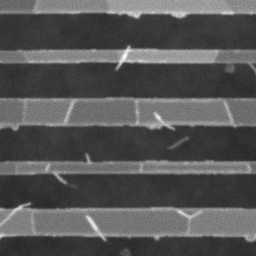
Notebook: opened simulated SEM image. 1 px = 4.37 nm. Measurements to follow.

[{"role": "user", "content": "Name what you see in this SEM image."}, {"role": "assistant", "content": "lines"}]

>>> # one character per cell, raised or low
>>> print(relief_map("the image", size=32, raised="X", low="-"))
XXXXXXXXXXXXXXXXXXXXXXXXXXXXXXXX
XXXXX--XXX---XXXXXXXXXXXXXXXXXXX
--------------------------------
--------------------------------
--------------------------------
--------------------------------
XXXXXXXXXXXXXXXXXXXXXXXXXXX-XXXX
XXXXXXXXXXXXXXXXXXXXXXXXXXX-XXXX
--------------------------------
--------------------------------
--------------------------------
--------------------------------
XX---XXXX---------XX--XXX-XX-XXX
XXXXXXXXX--------XXXXXXXXXXX-XXX
XXXXXXXX---------XXXXXXXXXXXXXXX
----XXXX----------XXXX--------XX
--------------------------------
--------------------------------
--------------------------------
--------------------------------
X-XXXX------------XXXXXXXXXXXXX-
X-XXXX------------XXXXXXXXXXXXXX
--------------------------------
--------------------------------
--------------------------------
--------------------------------
XXXX-------------------XXXXXXXXX
XXXX--------------------XXXXXXXX
XXXX--------------------XXXXXXXX
X-------------------------------
--------------------------------
--------------------------------